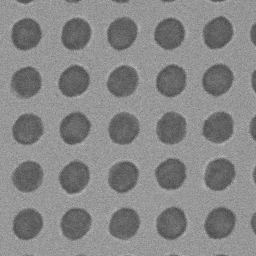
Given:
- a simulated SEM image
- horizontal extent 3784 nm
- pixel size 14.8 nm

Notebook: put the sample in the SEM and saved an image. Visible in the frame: a regular array of holes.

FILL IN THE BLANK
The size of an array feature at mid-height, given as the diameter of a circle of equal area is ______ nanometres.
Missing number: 474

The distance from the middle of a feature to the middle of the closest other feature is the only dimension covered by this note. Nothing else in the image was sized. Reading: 693 nanometers